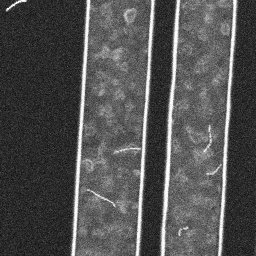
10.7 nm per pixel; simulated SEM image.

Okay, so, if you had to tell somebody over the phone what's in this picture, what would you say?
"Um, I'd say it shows one or a few lines or trenches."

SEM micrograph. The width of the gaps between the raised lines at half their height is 642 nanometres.